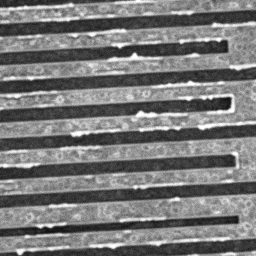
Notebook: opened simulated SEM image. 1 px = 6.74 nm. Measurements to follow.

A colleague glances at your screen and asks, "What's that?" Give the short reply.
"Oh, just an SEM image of parallel lines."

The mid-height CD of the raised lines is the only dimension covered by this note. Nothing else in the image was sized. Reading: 102 nm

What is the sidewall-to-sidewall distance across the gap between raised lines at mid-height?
0.09 micrometres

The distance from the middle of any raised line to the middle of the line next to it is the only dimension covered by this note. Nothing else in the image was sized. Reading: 0.193 microns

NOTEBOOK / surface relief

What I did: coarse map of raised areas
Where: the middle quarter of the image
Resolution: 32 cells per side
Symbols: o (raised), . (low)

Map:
oooooooooooooooooooooooooooooooo
oooooooooooooooooooooooooooooooo
oooooooooo......................
................................
...............................o
........................oooooooo
......oooooooooooooooooooooooooo
oooooooooooooooooooooooooooooooo
oooooooooooooooooooooooooooooooo
ooooooooooooo...................
................................
................................
..................ooooo.oooooooo
.........ooooooooooooooooooooooo
oooooooooooooooooooooooooooooooo
oooooooooooooooooooooooooooooooo
ooooooooooooooooooooooo..o......
oooooo..........................
................................
.............................ooo
........o..ooooooooooooooooooooo
oooooooooooooooooooooooooooooooo
oooooooooooooooooooooooooooooooo
oooooooooooooooooooooo..........
oooo............................
................................
................................
..............oooooooooooooooooo
oooooooooooooooooooooooooooooooo
oooooooooooooooooooooooooooooooo
oooooooooooooooooooooooo........
oooooo..........................